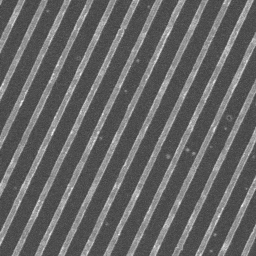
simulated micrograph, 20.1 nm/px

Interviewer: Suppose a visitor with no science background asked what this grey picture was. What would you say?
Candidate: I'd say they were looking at parallel lines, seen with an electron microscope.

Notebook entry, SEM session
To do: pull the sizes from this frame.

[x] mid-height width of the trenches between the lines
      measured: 306 nm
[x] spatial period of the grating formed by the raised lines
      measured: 0.415 µm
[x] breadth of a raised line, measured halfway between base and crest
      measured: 102 nm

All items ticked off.